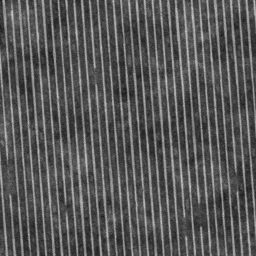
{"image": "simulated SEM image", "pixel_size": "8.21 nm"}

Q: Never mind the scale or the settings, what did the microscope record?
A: parallel lines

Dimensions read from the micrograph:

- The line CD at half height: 10.2 nm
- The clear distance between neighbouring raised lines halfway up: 51.3 nanometers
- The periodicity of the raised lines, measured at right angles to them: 64.2 nm